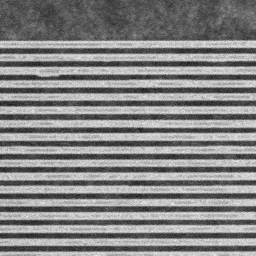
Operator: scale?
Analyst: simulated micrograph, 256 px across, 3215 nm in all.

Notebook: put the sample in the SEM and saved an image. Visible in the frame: parallel lines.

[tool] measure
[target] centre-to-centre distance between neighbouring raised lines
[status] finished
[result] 13.2 px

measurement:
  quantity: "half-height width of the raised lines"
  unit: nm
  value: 62.8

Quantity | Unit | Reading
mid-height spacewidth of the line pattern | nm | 98.9